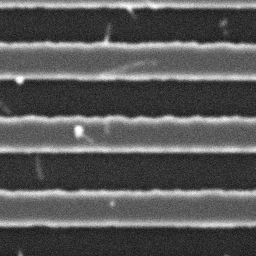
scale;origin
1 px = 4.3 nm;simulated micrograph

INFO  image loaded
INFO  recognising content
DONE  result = lines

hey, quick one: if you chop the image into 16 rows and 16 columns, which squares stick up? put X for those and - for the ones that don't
----------------
----------------
----------------
XXXXXXXXXXXXXXXX
XXXXXXXXXXXXXXXX
----------------
----------------
XXXXXXXXXXXXXXXX
XXXXXXXXXXXXXXXX
-X--------------
----------------
----------------
XXXXXXXXXXXXXXXX
XXXXXXXXXXXXXXXX
----------------
----------------